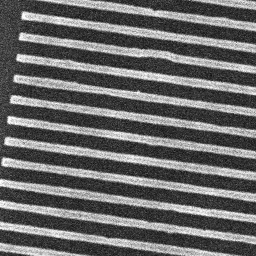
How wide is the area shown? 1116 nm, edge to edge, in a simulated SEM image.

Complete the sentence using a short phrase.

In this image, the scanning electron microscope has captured parallel lines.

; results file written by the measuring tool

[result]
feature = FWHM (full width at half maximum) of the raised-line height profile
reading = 27.5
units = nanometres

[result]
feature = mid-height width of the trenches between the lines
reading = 63.6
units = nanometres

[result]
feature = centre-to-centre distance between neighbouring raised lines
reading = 91.9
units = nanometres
